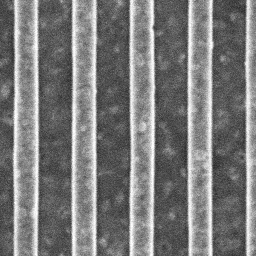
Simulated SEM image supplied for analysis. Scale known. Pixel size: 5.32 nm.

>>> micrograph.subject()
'parallel lines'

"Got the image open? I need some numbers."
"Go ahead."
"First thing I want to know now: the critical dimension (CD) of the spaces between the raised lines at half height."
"190 nm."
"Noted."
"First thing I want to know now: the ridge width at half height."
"118 nm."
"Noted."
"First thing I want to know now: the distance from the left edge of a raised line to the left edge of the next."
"308 nanometers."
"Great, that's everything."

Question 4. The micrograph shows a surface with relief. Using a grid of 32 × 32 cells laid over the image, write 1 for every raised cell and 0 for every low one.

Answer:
00111000011100001110000011000001
00111000011100001110000011000001
00111000011100001110000011000001
00111000011100001110000011000001
00111000011100001110000011000001
00111000011100001110000011100001
00111000011100001110000011000001
00111000011100001110000011000001
00111000011100001110000011000001
00111000011100001110000011000001
00111000011100001110000011000001
00111000011100001110000011000001
00111000011100001110000011000001
00111000011100001110000011000001
00111000011100001110000011000001
00111000011100001110000011000001
00111000011100001110000011000001
00111000011100001110000011000001
00111000011100000110000011000001
00111000011100000110000011000001
00111000011100000110000011000001
00111000011100001110000011000001
00111000011100001110000011000001
00111000011100001110000011000001
00111000011100001110000011000001
00111000011100001110000011000001
00111000011100001110000011000001
00111000011100001110000011000001
00111000011100001110000011000001
00111000011100001110000011000001
00111000011100001110000011000001
00111000011100001110000011000001